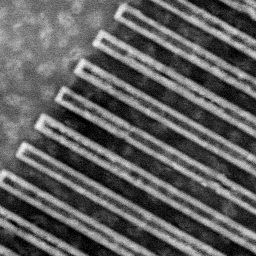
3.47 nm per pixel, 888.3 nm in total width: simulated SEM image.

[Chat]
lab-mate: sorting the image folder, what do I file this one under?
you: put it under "parallel lines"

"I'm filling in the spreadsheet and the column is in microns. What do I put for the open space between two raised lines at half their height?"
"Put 0.0732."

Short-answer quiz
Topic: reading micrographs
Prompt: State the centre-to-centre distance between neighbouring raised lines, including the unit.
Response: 0.117 um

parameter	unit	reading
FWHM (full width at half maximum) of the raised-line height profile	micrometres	0.0427